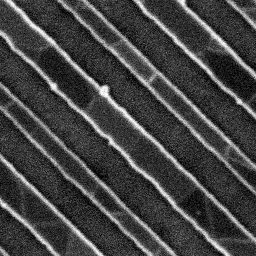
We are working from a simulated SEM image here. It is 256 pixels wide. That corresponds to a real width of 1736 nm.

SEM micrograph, lines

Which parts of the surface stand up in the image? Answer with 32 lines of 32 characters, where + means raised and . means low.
++......+++......++++++......+++
+++......+++......++++++......++
++++......+++......++++++......+
+++++......+++......++++++......
++++++......+++......++++++.....
.++++++......+++......++++++....
..++++++......+++......++++++...
...++++++......+++......++++++..
....++++++......+++......++++++.
.....++++++......+++......++++++
......++++++......+++......+++++
+......++++++......+++......++++
++......++++++......+++.......++
+++......++++++......+++.......+
.+++......++++++......+++.......
..+++.......+++++......++++.....
...+++......++++++......++++....
....+++.......+++++......++++...
.....+++.......+++++......++++..
......+++.......+++++......++++.
+......+++......++++++......++++
++......+++.......+++++......+++
+++......+++.......+++++......++
++++......+++.......+++++......+
+++++......+++.......+++++......
++++++......+++......++++++.....
.++++++......+++......+++++++...
...+++++......+++.......+++++...
....+++++......+++.......+++++..
.....+++++......++++......++++++
......+++++......++++......+++++
+.....++++++......++++......++++